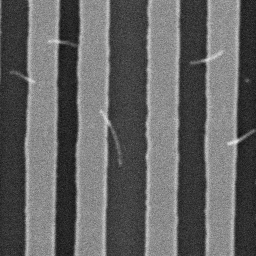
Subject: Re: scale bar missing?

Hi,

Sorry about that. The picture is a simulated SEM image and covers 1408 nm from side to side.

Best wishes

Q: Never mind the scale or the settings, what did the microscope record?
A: lines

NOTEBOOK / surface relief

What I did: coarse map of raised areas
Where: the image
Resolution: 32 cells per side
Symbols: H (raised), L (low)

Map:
LLLLHHHLLLHHHHLLLLLHHHLLLLHHHHLL
LLLLHHHLLLHHHHLLLLLHHHLLLLHHHHLL
LLLLHHHLLLHHHHLLLLLHHHLLLLHHHHLL
LLLLHHHLLLHHHLLLLLLHHHLLLLHHHHLL
LLLLHHHLLLHHHLLLLLLHHHLLLLHHHHLL
LLLLHHHLLLHHHLLLLLLHHHLLLLHHHHLL
LLLLHHHLLLHHHHLLLLLHHHLLLLHHHHLL
LLLLHHHLLLHHHLLLLLLHHHLLLLHHHHLL
LLLLHHHLLLHHHHLLLLLHHHLLLLHHHHLL
LLLLHHHLLLHHHLLLLLLHHHLLLLHHHHLL
LLLLHHHLLLHHHLLLLLHHHHLLLLHHHHLL
LLLLHHHLLLHHHLLLLLHHHHLLLLHHHHLL
LLLLHHHLLLHHHLLLLLHHHHLLLLHHHHLL
LLLLHHHLLLHHHLLLLLLHHHLLLLHHHHLL
LLLHHHHLLLHHHLLLLLLHHHLLLLHHHHLL
LLLHHHHLLLHHHHLLLLHHHHLLLLHHHHLL
LLLHHHHLLLHHHLLLLLHHHHLLLLHHHHLL
LLLHHHHLLLHHHLLLLLHHHHLLLLHHHHLL
LLLHHHHLLLHHHLLLLLHHHHLLLLHHHHLL
LLLHHHHLLLHHHLLLLLHHHHLLLLHHHHLL
LLLHHHHLLLHHHLLLLLHHHHLLLLHHHLLL
LLLHHHHLLLHHHLLLLLHHHHLLLLHHHLLL
LLLHHHHLLLHHHLLLLLHHHHLLLLHHHLLL
LLLHHHHLLLHHHLLLLLHHHHLLLLHHHLLL
LLLHHHHLLLHHHLLLLLHHHHLLLLHHHLLL
LLLHHHHLLLHHHLLLLLHHHHLLLLHHHLLL
LLLHHHHLLLHHHLLLLLHHHHLLLLHHHLLL
LLLHHHHLLLHHHLLLLLHHHHLLLLHHHLLL
LLLHHHHLLLHHHLLLLLHHHHLLLLHHHLLL
LLLHHHHLLLHHHLLLLLHHHHLLLLHHHLLL
LLLHHHHLLHHHHLLLLLHHHHLLLLHHHLLL
LLLHHHHLLHHHHLLLLLHHHHLLLLHHHLLL